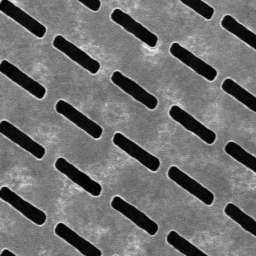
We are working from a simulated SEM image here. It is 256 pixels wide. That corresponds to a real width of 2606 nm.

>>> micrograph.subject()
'a regular array of holes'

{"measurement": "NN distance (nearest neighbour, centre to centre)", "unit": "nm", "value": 629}